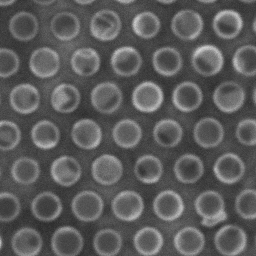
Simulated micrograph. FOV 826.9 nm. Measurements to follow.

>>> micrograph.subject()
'a regular array of raised bodies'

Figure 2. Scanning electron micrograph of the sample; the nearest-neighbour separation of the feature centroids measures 131 nanometres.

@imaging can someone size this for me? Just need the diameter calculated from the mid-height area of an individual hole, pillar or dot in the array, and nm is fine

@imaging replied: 90.4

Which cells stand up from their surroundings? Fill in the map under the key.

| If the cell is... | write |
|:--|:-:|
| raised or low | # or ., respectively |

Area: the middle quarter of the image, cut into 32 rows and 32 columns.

..#######...#######....######...
...#####.....#####.....#####....
....###.......###........##.....
................................
................................
##.......####......####......###
###....#######....######....####
####...#######...#######....####
####...#######...#######....####
####...#######....######....####
###....#######....######....####
##.......####.......##........##
................................
................................
....###.......###.......####....
...#####.....#####.....######...
..#######...#######....######...
..#######...#######....######...
..#######....######....######...
...######....#####.....######...
....####.......##........##.....
................................
................................
##..................###......###
###...............######....####
####..............######....####
####..............######....####
####..............######....####
###................#####.....###
###...........................##
................................
................................